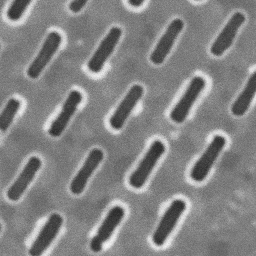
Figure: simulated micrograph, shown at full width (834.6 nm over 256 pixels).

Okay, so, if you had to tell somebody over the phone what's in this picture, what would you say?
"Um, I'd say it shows a regular array of holes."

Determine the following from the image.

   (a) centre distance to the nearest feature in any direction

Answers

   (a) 199 nm